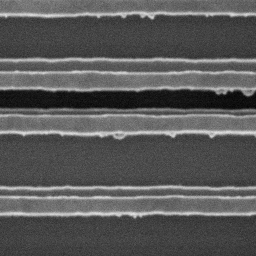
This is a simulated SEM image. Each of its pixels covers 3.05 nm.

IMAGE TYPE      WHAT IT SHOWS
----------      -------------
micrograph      lines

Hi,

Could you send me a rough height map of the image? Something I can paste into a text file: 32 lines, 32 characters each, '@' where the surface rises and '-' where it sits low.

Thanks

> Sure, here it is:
@@@@@@@@@@@@@@@@@@@@@@@@@@@@@@@@
@@@@@@@@@@@@@@@@@@@@@@@@@@@@@@@@
--------------------------------
--------------------------------
--------------------------------
--------------------------------
--------------------------------
--------@@@@@@-----@@-----------
@@@@@@@@@@@@@@@@@@@@@@@@@@@@@@@@
@@@@@@@@@@@@@@@@@@@@@@@@@@@@@@@@
@@@@@@@@@@@@@@@@@@@@@@@@@@@@@@@@
---------------------------@--@@
--------------------------------
--------------------------------
@@@@@@@@@@@@@@@@@@@@@@@@@@@@@@@@
@@@@@@@@@@@@@@@@@@@@@@@@@@@@@@@@
@-@@-@-@@@@@@@@@@@@@@@----@@--@@
--------------------------------
--------------------------------
--------------------------------
--------------------------------
--------------------------------
--------------------------------
--------@--@@-@@@-@@@@@---------
@@@@@@@@@@@@@@@@@@@@@@@@@@@@@@@@
@@@@@@@@@@@@@@@@@@@@@@@@@@@@@@@@
@@@@@@@@@@@@@@@@@@@@@@@@@@@@@@@@
--------------------------------
--------------------------------
--------------------------------
--------------------------------
--------------------------------